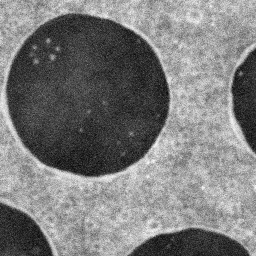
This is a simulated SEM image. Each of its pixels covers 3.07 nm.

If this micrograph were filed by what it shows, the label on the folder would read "holes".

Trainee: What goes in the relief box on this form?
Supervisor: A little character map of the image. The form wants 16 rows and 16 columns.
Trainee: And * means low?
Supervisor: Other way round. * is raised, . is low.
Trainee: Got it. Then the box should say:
****************
***.....********
*........*******
*.........*****.
*.........*****.
...........***..
...........***..
*.........*****.
*.........*****.
**.......*******
***.....********
****************
****************
..**************
...********...**
...*****.......*